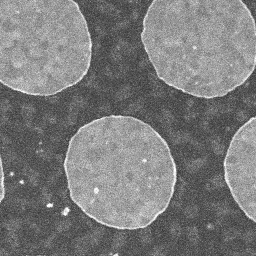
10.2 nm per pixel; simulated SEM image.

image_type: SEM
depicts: raised bodies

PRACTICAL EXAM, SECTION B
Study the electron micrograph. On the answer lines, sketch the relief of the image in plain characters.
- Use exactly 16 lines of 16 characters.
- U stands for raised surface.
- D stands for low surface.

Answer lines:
UUUUUDDDDUUUUUUD
UUUUUDDDDUUUUUUU
UUUUUUDDDUUUUUUU
UUUUUUDDDUUUUUUU
UUUUUDDDDDUUUUUU
DUUUDDDDDDDUUUUD
DDDDDDDDDDDDDDDD
DDDDDDUUUDDDDDDD
DDDDDUUUUUDDDDDU
DDDDUUUUUUUDDDUU
DDDDUUUUUUUDDDUU
DDDDUUUUUUUDDDUU
DDDDDUUUUUUDDDDU
DDDDDDUUUUDDDDDD
DDDDDDDDDDDDDDDD
DDDDDDDDDDDDDDDD